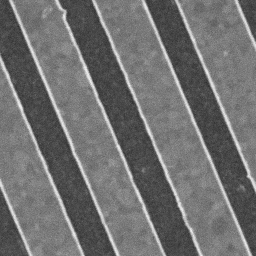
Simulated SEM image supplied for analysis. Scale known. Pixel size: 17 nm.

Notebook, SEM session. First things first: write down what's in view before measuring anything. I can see one or a few lines or trenches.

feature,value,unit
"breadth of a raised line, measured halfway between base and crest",772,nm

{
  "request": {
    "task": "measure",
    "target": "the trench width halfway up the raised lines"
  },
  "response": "0.548 micrometres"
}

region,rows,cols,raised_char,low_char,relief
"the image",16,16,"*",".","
.***..***..****.
.***..****..***.
..***..***..****
..***..***..****
...**...***..***
*..***..***..***
*..***...***..**
**..***..***..**
**..***..****..*
**...***..***..*
***..***..***..*
***..***...***..
****..***..***..
.***..***..****.
.****..***..***.
..***..***..***.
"